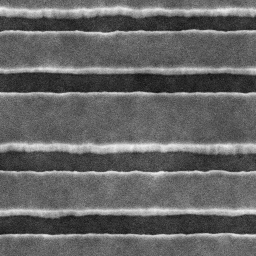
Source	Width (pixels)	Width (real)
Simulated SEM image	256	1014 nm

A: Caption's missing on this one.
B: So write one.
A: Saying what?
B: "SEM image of lines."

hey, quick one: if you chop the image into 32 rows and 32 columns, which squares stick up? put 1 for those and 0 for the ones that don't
11111111111111111111111111111111
11111111111110001111111111111111
00000000000000000000000000000000
00000000000000000000000000000000
11111111111111111111111111111111
11111111111111111111111111111111
11111111111111111111111111111111
11111111111111111111111111111111
11111111111111111111111111111111
00000000000000000000000000000000
00000000000000000000000000000000
00000000000000000000000000000000
11111111111111111111111111111111
11111111111111111111111111111111
11111111111111111111111111111111
11111111111111111111111111111111
11111111111111111111111111111111
11111111111111111111111111111111
10011111111111111111111111111111
00000000000000000000000000000000
00000000000000000000000000000000
11111111110101101100101111111011
11111111111111111111111111111111
11111111111111111111111111111111
11111111111111111111111111111111
11111111111111111111111111111111
11111111111111111111111011111111
00000000000000000000000000000000
00000000000000000000000000000000
11111111111111111111111111111111
11111111111111111111111111111111
11111111111111111111111111111111